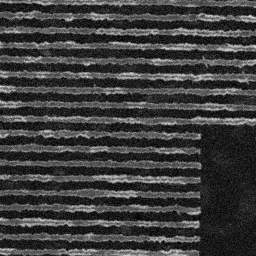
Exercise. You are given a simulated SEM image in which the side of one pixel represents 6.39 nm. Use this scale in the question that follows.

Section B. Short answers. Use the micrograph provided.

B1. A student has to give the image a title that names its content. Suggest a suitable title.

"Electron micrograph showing parallel lines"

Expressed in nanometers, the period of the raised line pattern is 94.2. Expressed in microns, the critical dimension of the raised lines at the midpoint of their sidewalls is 0.0335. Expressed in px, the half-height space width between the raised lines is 9.37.